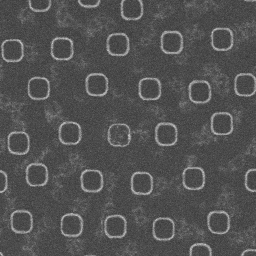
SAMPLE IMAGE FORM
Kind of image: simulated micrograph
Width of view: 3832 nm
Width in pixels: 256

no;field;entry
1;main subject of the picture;a regular array of raised bodies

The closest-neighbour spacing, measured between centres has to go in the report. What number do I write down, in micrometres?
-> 0.697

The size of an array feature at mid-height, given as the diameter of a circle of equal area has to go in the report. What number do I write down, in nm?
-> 340